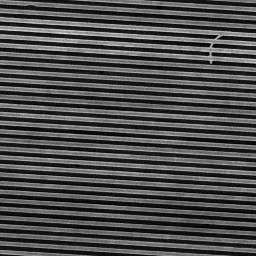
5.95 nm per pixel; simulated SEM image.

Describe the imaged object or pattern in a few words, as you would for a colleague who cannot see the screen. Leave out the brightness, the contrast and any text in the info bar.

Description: parallel lines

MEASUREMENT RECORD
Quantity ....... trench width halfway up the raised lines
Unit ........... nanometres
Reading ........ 28.2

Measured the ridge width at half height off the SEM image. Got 23 nanometres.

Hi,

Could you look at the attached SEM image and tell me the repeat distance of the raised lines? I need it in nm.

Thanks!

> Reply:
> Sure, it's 51.2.